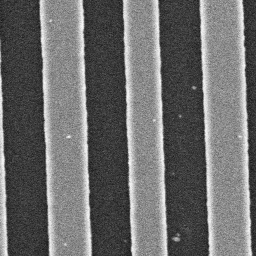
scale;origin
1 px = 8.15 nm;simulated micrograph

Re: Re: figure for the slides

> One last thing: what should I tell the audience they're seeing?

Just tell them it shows lines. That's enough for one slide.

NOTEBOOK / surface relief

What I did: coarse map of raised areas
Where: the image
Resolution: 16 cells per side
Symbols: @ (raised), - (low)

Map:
---@@---@@---@@-
---@@---@@---@@-
---@@---@@---@@-
---@@---@@---@@-
---@@---@@---@@-
---@@---@@---@@-
---@@---@@---@@-
---@@---@@---@@-
---@@---@@---@@-
---@@---@@---@@-
---@@---@@---@@-
---@@@--@@---@@@
---@@@--@@---@@@
---@@@--@@---@@@
---@@@--@@---@@@
---@@@--@@---@@@